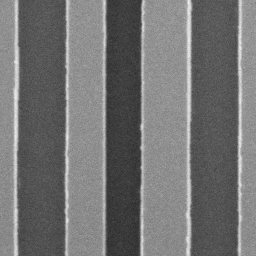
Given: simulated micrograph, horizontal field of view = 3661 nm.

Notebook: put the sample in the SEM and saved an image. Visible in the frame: lines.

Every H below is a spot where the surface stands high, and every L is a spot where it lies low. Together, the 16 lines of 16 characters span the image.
HLLLHHHLLHHHLLLH
HLLLHHHLLHHHLLLH
HLLLHHHLLHHHLLLH
HLLLHHLLLHHHLLLH
HLLLHHLLLHHHLLLH
HLLLHHLLLHHHLLLH
HLLLHHLLLHHHLLLH
HLLLHHLLLHHHLLLH
HLLLHHLLLHHHLLLH
HLLLHHLLLHHHLLLH
HLLLHHLLLHHHLLLH
HLLLHHLLLHHHLLLH
HLLLHHLLLHHHLLLH
HLLLHHLLLHHHLLLH
HLLLHHLLLHHHLLLH
HLLLHHLLLHHHLLLH